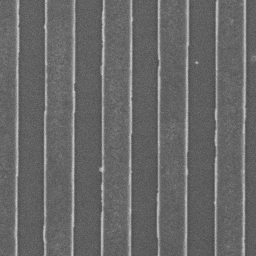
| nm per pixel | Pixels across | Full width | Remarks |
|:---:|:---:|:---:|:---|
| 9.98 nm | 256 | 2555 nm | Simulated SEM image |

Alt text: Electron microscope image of lines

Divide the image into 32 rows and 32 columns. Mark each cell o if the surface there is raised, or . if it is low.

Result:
oo....ooo....ooo....ooo....oooo.
oo....ooo....ooo....oooo...oooo.
oo....ooo....ooo....oooo...oooo.
oo....ooo....ooo....oooo...oooo.
oo....ooo....ooo....oooo...oooo.
oo....ooo....ooo....ooo....oooo.
oo....ooo....ooo....ooo....oooo.
oo....ooo....ooo....ooo....oooo.
oo....ooo....ooo....ooo....oooo.
oo....ooo....ooo....ooo....oooo.
oo....ooo....ooo....ooo....oooo.
oo....ooo....ooo....ooo....oooo.
oo....ooo....ooo....ooo....oooo.
oo....ooo....ooo....ooo....oooo.
oo....ooo....ooo....ooo....oooo.
oo....ooo....ooo....ooo....oooo.
oo....ooo....ooo....ooo....oooo.
oo....ooo....ooo....ooo....oooo.
oo....ooo....ooo....ooo....oooo.
oo....ooo....ooo....ooo....oooo.
oo....ooo....ooo....ooo....oooo.
oo....ooo....ooo....ooo....oooo.
oo....ooo....ooo....ooo....oooo.
oo....ooo....ooo....ooo....oooo.
oo....ooo....ooo....ooo....oooo.
oo....ooo....ooo....ooo....oooo.
oo....ooo....ooo....ooo....oooo.
oo....ooo....ooo....ooo....oooo.
oo....ooo....ooo....ooo....oooo.
oo....ooo....ooo....ooo....oooo.
oo....ooo....ooo....ooo....oooo.
oo....ooo....ooo....ooo....oooo.